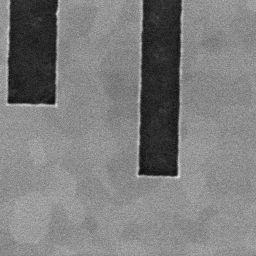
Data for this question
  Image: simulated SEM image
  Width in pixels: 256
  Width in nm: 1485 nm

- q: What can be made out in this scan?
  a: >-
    one or a few lines or trenches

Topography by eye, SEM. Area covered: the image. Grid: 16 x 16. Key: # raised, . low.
#...#####..#####
#...#####..#####
#...#####..#####
#...#####..#####
....#####..#####
....#####..#####
#..######..#####
#########..#####
#########..#####
#########..#####
#########..#####
################
################
################
################
################